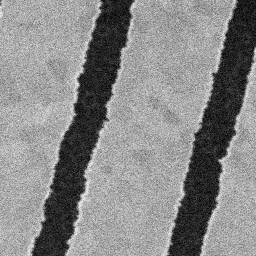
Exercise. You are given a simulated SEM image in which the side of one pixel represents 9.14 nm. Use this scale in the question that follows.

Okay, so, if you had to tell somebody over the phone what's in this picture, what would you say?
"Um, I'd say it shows one or a few lines or trenches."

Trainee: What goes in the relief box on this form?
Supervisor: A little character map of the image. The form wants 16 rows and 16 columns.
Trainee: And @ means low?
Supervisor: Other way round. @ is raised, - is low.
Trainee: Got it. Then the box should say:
@@@@@@--@@@@@@@-
@@@@@@--@@@@@@--
@@@@@@--@@@@@@--
@@@@@---@@@@@@--
@@@@@--@@@@@@---
@@@@@--@@@@@@--@
@@@@@--@@@@@@--@
@@@@---@@@@@@--@
@@@@--@@@@@@---@
@@@@--@@@@@@--@@
@@@--@@@@@@@--@@
@@@--@@@@@@---@@
@@@--@@@@@@---@@
@@@--@@@@@@--@@@
@@---@@@@@@--@@@
@@--@@@@@@@--@@@